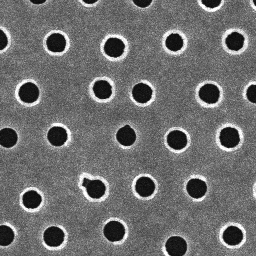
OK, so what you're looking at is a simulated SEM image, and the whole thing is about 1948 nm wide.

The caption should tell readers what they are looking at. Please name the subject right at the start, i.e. a regular array of holes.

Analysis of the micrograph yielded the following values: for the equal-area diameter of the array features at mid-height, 154 nm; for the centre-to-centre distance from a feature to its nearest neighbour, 366 nm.